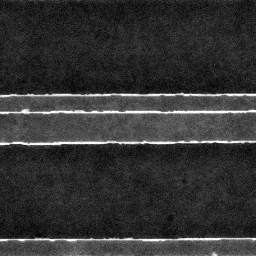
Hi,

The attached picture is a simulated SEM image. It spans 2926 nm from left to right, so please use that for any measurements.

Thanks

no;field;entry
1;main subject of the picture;lines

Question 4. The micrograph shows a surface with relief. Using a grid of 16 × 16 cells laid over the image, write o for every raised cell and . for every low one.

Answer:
................
................
................
................
................
................
oooooooooooooooo
oooooooooooooooo
oooooooooooooooo
................
................
................
................
................
................
oooooooooooooooo